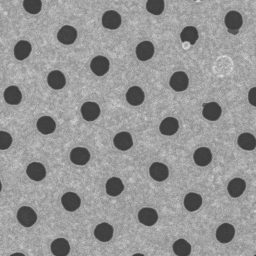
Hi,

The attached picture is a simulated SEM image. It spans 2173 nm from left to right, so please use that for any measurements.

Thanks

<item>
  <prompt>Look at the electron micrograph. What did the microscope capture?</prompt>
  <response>a regular array of holes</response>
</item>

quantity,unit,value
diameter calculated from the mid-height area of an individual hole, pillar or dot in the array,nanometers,164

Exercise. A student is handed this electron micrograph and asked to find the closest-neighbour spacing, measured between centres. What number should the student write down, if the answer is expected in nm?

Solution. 383